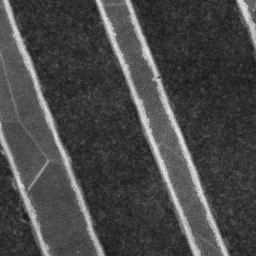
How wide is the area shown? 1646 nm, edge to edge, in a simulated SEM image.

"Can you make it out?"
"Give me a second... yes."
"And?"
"one or a few lines or trenches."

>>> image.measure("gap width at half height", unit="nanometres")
562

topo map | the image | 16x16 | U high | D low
UDDDDDUUDDDDDDDU
UDDDDDDUUDDDDDDD
UDDDDDDUUDDDDDDD
UUDDDDDUUDDDDDDD
UUDDDDDDUUDDDDDD
UUDDDDDDUUDDDDDD
UUUDDDDDDUDDDDDD
UUUDDDDDDUUDDDDD
UUUDDDDDDUUDDDDD
UUUUDDDDDDUUDDDD
DUUUDDDDDDUUDDDD
DUUUUDDDDDDUDDDD
DDUUUDDDDDDUUDDD
DDUUUDDDDDDUUDDD
DDUUUUDDDDDDUUDD
DDDUUUDDDDDDUUDD